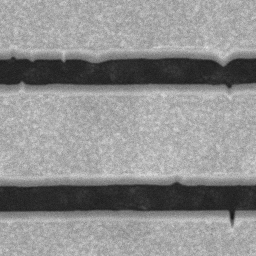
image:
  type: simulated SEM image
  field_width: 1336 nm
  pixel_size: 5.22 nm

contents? one or a few lines or trenches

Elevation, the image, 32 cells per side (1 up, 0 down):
11111111111111111111111111111111
11111111111111111111111111111111
11111111111111111111111111111111
11111111111111111111111111111111
11111111111111111111111111111111
11111111111111111111111111111111
11111111111111111111111111111111
00000000000000000000000000000000
00000000000000000000000000000000
00000000000000000000000000000000
00000000000000000000000000000000
11111111111111111111111111111111
11111111111111111111111111111111
11111111111111111111111111111111
11111111111111111111111111111111
11111111111111111111111111111111
11111111111111111111111111111111
11111111111111111111111111111111
11111111111111111111111111111111
11111111111111111111111111111111
11111111111111111111111111111111
11111111111111111111111111111111
11111111011110000000000000111111
00000000000000000000000000000000
00000000000000000000000000000000
00000000000000000000000000000000
00000000000000000000000000000000
11111111111111111111111111111111
11111111111111111111111111111111
11111111111111111111111111111111
11111111111111111111111111111111
11111111111111111111111111111111